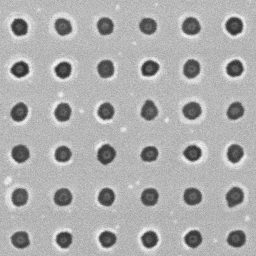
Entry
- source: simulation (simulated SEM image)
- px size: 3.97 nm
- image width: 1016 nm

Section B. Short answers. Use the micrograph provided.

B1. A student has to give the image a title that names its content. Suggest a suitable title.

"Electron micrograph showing a regular array of ring-shaped grooves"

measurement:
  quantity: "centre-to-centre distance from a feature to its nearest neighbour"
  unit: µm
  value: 0.168